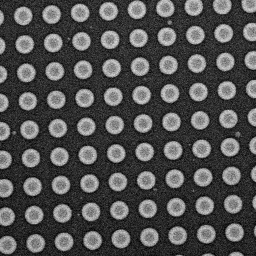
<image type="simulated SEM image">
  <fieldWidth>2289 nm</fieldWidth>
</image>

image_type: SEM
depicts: an array of small figures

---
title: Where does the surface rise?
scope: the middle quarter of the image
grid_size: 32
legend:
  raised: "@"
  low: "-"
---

---@@@@---@@@@---@@@@---@@@@---@
---@@@@---@@@@---@@@@---@@@@----
---@@@@---@@@@----@@------------
----@@--------------------------
--------------------------------
-------------------------@@@----
----@@-----@@@---@@@@---@@@@@--@
---@@@@---@@@@---@@@@@--@@@@@--@
---@@@@---@@@@---@@@@----@@@----
---@@@@---@@@@----@@@-----@-----
----@@--------------------------
--------------------------------
--------------------------@@----
-----@-----@@@----@@@@---@@@@---
----@@@@---@@@@---@@@@---@@@@---
@--@@@@@---@@@@---@@@@---@@@@---
@--@@@@@---@@@@---@@@-----@@----
----@@@-------------------------
--------------------------------
--------------------------@@----
------------@@----@@@@---@@@@---
----@@@@---@@@@---@@@@---@@@@---
@---@@@@---@@@@---@@@@---@@@@---
@---@@@@---@@@@----@@@----@@----
@----@@-----@@------------------
--------------------------------
---------------------------@----
------------@@-----@@@----@@@@--
@----@@@---@@@@---@@@@@---@@@@--
@---@@@@@--@@@@@--@@@@@---@@@@--
@---@@@@---@@@@----@@@----@@@---
@----@@@----@@------------------